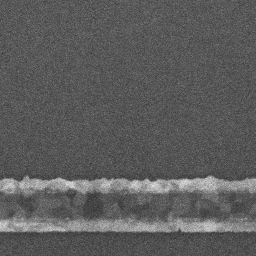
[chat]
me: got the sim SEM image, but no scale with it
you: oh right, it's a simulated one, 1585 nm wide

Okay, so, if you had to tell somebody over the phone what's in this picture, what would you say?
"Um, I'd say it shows one or a few lines or trenches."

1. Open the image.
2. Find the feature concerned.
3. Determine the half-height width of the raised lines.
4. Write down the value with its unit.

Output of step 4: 274 nanometers